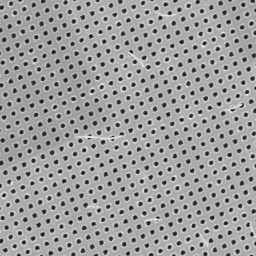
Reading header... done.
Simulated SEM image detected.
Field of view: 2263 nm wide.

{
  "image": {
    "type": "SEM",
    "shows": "a regular array of holes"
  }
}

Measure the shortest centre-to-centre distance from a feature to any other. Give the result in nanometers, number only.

87.8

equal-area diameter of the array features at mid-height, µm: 0.0423